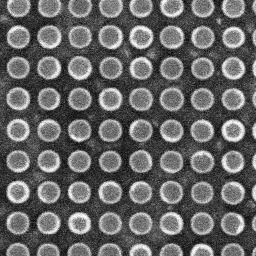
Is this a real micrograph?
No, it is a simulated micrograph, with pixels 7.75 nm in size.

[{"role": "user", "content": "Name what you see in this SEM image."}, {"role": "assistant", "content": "a regular array of raised bodies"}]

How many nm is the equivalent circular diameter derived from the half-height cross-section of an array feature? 167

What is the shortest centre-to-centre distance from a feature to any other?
0.237 µm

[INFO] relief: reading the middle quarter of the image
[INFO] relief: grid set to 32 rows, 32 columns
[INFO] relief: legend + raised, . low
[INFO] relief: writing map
.++++++..+++++...+++++...++++...
.++++++..+++++...+++++..++++++..
..++++....++++...++++....++++...
...++.....................+.....
................................
................................
...++.....+++.....++.....+++....
..++++...+++++...+++++..+++++...
.++++++..+++++..++++++..++++++..
.++++++..+++++...+++++..++++++..
..++++...+++++...++++....++++...
................................
................................
................................
...++.....+++.....+++.....++....
.+++++...+++++...+++++..+++++...
.++++++..+++++..++++++..++++++..
.++++++..+++++...+++++..++++++..
..++++....+++....++++....++++...
................................
................................
................................
..++++....+++....++++....++++...
.+++++...+++++...+++++..+++++...
.+++++...+++++...+++++..+++++...
..++++...+++++...+++++..+++++...
...++.....+++.....+++....++++...
................................
................................
................................
..++++...+++++...++++....++++...
.+++++...+++++...+++++..++++++..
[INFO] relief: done